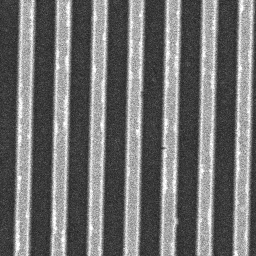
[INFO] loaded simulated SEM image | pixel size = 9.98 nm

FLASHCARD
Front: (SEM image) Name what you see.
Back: parallel lines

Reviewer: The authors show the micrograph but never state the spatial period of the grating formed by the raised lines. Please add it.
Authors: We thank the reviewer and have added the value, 364 nm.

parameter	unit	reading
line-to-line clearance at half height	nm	220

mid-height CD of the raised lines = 14.6 pixels